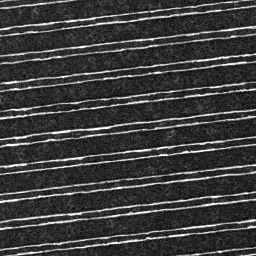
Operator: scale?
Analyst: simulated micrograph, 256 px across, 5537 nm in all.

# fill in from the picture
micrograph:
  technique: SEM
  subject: parallel lines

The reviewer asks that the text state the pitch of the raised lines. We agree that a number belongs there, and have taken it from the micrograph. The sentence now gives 593 nanometres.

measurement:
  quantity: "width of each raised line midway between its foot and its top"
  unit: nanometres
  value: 166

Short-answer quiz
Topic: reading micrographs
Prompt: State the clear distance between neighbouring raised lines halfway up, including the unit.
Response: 438 nanometers